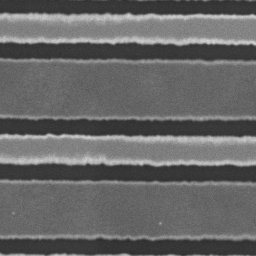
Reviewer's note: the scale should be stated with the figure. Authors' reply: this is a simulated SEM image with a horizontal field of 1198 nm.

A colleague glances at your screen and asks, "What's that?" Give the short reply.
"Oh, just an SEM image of lines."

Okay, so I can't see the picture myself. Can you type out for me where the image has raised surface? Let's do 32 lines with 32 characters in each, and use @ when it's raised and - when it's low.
--------------------------------
--------------------------------
@@@@@@@@@@@@@@@@@@@@@@@@@@@@@@@@
@@@@@@@@@@@@@@@@@@@@@@@@@@@@@@@@
@@@@@@@@@@@@@@@@@@@@@@@@@@@@@@@@
--------------@--@@@@@@@@@@@@@@@
--------------------------------
@@@@@@@@@@@-@@@----@------------
@@@@@@@@@@@@@@@@@@@@@@@@@@@@@@@@
@@@@@@@@@@@@@@@@@@@@@@@@@@@@@@@@
@@@@@@@@@@@@@@@@@@@@@@@@@@@@@@@@
@@@@@@@@@@@@@@@@@@@@@@@@@@@@@@@@
@@@@@@@@@@@@@@@@@@@@@@@@@@@@@@@@
@@@@@@@@@@@@@@@@@@@@@@@@@@@@@@@@
@@@@@@@@@@@@@@@@@@@@@@@@@@@@@@@@
--------------------------------
--------------------------------
@@@@@@@@@@@@@@@@@@@@@@@@@@@@@@@@
@@@@@@@@@@@@@@@@@@@@@@@@@@@@@@@@
@@@@@@@@@@@@@@@@@@@@@@@@@@@@@@@@
--@@@---@@@@-@@@@@@@@@@@@@@@@@@@
--------------------------------
@---@---------------------------
@@@@@@@@@@@@@@@@@@@@@@@@@@@@@@@@
@@@@@@@@@@@@@@@@@@@@@@@@@@@@@@@@
@@@@@@@@@@@@@@@@@@@@@@@@@@@@@@@@
@@@@@@@@@@@@@@@@@@@@@@@@@@@@@@@@
@@@@@@@@@@@@@@@@@@@@@@@@@@@@@@@@
@@@@@@@@@@@@@@@@@@@@@@@@@@@@@@@@
@@@@@@@@@@@@@@@@@@@@@@@@@@@@@@@@
--------------------------------
--------------------------------